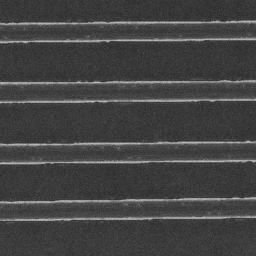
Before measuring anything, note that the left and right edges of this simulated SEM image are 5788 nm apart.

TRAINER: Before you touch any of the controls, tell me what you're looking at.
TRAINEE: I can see lines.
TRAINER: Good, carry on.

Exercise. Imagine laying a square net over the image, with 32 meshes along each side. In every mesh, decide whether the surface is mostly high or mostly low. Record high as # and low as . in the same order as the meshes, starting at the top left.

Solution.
................................
................................
................................
################################
################################
................................
................................
................................
................................
................................
################################
################################
#######################.........
................................
................................
................................
................................
................................
################################
################################
................................
................................
................................
................................
................................
################################
################################
................................
................................
................................
................................
................................